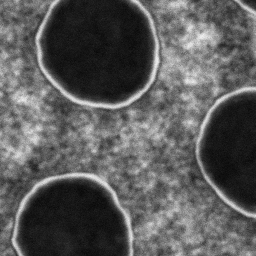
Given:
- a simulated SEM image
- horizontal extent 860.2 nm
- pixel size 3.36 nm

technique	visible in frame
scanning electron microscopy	raised bodies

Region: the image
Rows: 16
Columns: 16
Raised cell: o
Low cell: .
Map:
...oooooo......o
...ooooooo......
..oooooooo......
..oooooooo......
...ooooooo......
....ooooo.......
.....ooo......oo
.............ooo
............oooo
............oooo
.............ooo
..ooooo......ooo
..ooooo.......oo
.ooooooo........
.ooooooo........
.ooooooo........